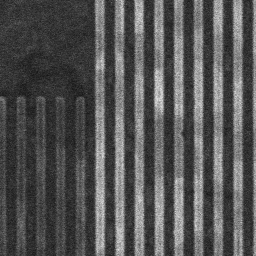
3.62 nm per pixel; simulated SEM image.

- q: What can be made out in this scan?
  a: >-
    parallel lines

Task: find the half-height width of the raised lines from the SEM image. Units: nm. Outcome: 25.8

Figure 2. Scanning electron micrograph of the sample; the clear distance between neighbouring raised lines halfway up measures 0.0448 micrometres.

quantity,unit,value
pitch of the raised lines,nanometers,71.5